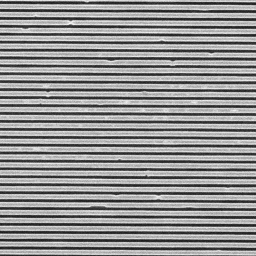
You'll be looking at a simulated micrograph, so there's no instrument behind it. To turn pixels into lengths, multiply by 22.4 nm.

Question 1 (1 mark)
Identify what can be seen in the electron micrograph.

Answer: parallel lines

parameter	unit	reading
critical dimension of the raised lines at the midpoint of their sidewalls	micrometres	0.098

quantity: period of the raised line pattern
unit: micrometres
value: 0.177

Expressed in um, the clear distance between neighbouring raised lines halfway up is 0.0784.